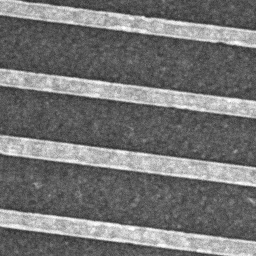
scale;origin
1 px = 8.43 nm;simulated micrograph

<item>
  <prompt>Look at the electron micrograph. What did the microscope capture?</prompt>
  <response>one or a few lines or trenches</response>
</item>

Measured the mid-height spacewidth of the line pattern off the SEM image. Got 463 nm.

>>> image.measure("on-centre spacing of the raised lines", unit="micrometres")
0.587